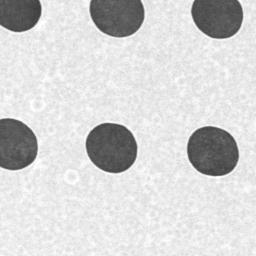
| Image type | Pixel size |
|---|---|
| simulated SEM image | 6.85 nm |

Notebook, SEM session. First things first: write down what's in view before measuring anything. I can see holes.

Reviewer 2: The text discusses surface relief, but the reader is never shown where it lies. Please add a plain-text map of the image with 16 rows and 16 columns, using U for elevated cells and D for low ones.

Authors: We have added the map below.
DDDUUUDDDUUUDDDU
DDUUUUDDDUUUDDDU
UUUUUUUUUUUUUUUU
UUUUUUUUUUUUUUUU
UUUUUUUUUUUUUUUU
UUUUUUUUUUUUUUUU
UUUUUUUUUUUUUUUU
DUUUUUUUUUUUUUUU
DDUUUDDDUUUUDDUU
DDUUUDDDDUUUDDDU
DUUUUUDDUUUUDDDU
UUUUUUUUUUUUUUUU
UUUUUUUUUUUUUUUU
UUUUUUUUUUUUUUUU
UUUUUUUUUUUUUUUU
UUUUUUUUUUUUUUUU